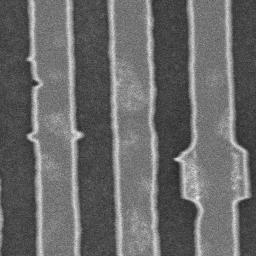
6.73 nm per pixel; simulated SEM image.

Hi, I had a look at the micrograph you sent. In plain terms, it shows one or a few lines or trenches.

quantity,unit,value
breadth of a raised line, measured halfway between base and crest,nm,264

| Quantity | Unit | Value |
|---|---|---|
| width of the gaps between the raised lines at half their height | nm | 270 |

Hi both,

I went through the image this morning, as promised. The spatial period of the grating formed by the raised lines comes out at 533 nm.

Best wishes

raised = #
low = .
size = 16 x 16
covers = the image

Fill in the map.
..##...##...##..
..##...##...##..
..##...##...##..
..##...##...##..
..###..###..##..
..###..###..##..
..###..###..###.
..###..##...###.
..###..###..###.
..###..###..###.
..###..###.####.
..###..###.#####
..###..###..###.
..###..###..###.
..###..###..###.
..###..###..###.